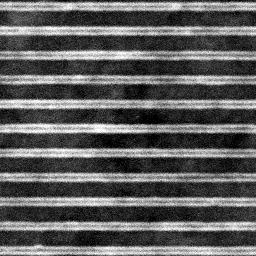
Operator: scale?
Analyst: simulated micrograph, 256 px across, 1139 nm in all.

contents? parallel lines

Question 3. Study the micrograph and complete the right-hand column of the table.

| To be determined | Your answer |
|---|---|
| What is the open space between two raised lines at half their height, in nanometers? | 81.8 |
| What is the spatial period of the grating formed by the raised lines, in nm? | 109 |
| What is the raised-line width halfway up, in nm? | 30.1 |